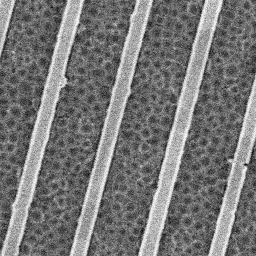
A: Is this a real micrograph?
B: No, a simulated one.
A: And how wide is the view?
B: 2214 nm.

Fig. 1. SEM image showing one or a few lines or trenches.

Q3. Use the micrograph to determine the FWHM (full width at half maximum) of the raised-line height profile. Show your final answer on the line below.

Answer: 0.115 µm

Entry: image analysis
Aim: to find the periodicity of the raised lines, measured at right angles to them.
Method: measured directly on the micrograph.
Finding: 0.576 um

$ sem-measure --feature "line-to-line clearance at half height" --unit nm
458